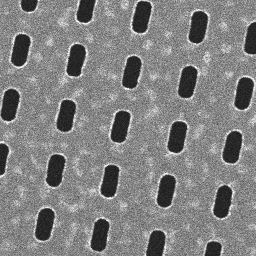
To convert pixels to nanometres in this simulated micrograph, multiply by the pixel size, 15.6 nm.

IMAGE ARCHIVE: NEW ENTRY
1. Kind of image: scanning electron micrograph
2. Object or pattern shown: a regular array of holes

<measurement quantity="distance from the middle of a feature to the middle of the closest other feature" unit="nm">860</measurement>